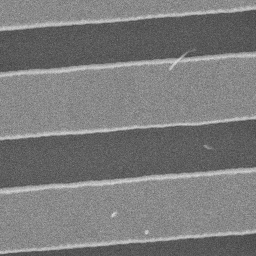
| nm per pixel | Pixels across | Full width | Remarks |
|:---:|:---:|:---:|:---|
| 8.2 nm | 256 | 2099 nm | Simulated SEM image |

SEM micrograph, lines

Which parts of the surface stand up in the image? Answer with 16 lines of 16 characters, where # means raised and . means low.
################
######..........
................
.............###
.###############
################
################
###############.
###.............
................
................
.....###########
################
################
################
#####...........